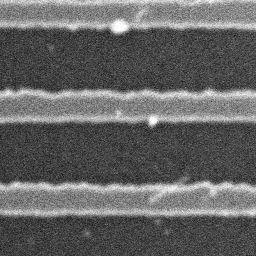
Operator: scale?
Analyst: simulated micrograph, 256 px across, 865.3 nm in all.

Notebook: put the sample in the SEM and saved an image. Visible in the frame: lines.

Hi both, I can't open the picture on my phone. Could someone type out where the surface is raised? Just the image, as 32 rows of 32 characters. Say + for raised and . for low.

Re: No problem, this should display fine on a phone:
++++++++++++++++++++++++++++++++
++++++++++++++++++++++++++++++++
++++++++++++++++++++++++++++++++
..............++...............+
................................
................................
................................
................................
................................
................................
................................
..+++...+.++++....+.......+.....
++++++++++++++++++++++++++++++++
++++++++++++++++++++++++++++++++
++++++++++++++++++++++++++++++++
................................
................................
................................
................................
................................
................................
................................
................................
+++++++++++++++++++++++++++++++.
++++++++++++++++++++++++++++++++
++++++++++++++++++++++++++++++++
++++++++++++++++++++++++++++++++
................................
................................
................................
................................
................................